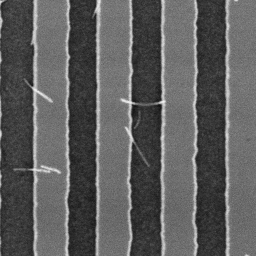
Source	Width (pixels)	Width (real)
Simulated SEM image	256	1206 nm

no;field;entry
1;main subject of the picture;lines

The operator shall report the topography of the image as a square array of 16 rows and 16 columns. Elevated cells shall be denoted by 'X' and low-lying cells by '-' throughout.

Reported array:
--XX--XX--XX--XX
--XX--XX--XX--XX
--XX--XX--XX--XX
--XX--XX--XX--XX
--XX--XX--XX--XX
--XX--XX--XX--XX
--XX--XX--XX--XX
--XX--XX--XX--XX
--XX--XX--XX--XX
--XX--XX--XX--XX
--XX--XX--XX--XX
--XX--XX--XX--XX
--XX--XX--XX--XX
--XX--XX--XX--XX
--XX--XX--XX--XX
--XX--XX--XX--XX